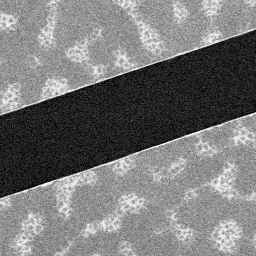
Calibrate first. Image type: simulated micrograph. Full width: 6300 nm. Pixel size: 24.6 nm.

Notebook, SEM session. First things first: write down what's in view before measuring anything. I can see one or a few lines or trenches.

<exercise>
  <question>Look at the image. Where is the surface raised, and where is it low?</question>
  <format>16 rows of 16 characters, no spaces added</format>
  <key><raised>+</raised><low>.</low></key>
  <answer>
++++++++++++++++
++++++++++++++++
++++++++++++++..
+++++++++++.....
++++++++........
+++++...........
++..............
...............+
............++++
.........+++++++
......++++++++++
...+++++++++++++
++++++++++++++++
++++++++++++++++
++++++++++++++++
++++++++++++++++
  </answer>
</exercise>